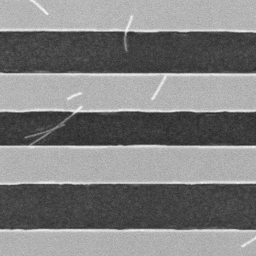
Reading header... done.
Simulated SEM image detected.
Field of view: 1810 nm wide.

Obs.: lines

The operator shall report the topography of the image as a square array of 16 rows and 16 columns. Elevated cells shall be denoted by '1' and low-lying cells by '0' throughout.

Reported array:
1111111111111111
1111111111111111
0000000000000000
0000000000000000
0000000000000000
1111111111111111
1111111111111111
0000000000000000
0000000000000000
1111111111111111
1111111111111111
1100110000010000
0000000000000000
0000000000000000
1111111111111111
1111111111111111